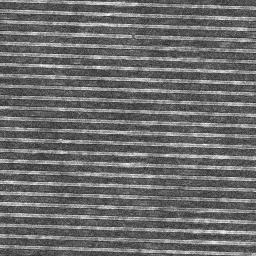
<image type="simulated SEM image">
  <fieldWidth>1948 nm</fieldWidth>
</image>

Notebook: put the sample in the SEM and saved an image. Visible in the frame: parallel lines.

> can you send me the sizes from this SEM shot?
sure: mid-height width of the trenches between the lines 58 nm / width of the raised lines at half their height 21.9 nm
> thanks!